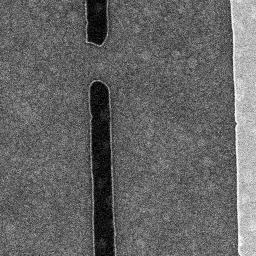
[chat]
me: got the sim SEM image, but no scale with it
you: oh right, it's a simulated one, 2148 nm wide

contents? one or a few lines or trenches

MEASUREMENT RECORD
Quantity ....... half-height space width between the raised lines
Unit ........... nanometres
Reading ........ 1050